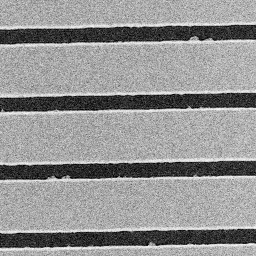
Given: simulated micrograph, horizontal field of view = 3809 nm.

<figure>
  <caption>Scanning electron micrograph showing lines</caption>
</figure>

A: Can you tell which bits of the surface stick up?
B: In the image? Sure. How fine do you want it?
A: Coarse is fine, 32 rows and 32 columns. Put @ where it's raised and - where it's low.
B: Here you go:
@@@@@@@@@@@@@@@@@@@@@@@@@@@@@@@@
@@@@@@@@@@@@@@@@@@@@@@@@@@@@@@@@
@@@@@@@@@@@@@@@@@@@@@@@@@@@@@@@@
@@------------------------------
--------------------------------
---------@@@@@@@@@@@@@@@@@@@@@@@
@@@@@@@@@@@@@@@@@@@@@@@@@@@@@@@@
@@@@@@@@@@@@@@@@@@@@@@@@@@@@@@@@
@@@@@@@@@@@@@@@@@@@@@@@@@@@@@@@@
@@@@@@@@@@@@@@@@@@@@@@@@@@@@@@@@
@@@@@@@@@@@@@@@@@@@@@@@@@@@@@@@@
@@@@@@@@@@@@@@@@@@@@@@@@@@@@@@@@
--------------------------------
--------------------------------
@@@@@@@@@@@@@@@@@@@@@@@@@@@@@@@@
@@@@@@@@@@@@@@@@@@@@@@@@@@@@@@@@
@@@@@@@@@@@@@@@@@@@@@@@@@@@@@@@@
@@@@@@@@@@@@@@@@@@@@@@@@@@@@@@@@
@@@@@@@@@@@@@@@@@@@@@@@@@@@@@@@@
@@@@@@@@@@@@@@@@@@@@@@@@@@@@@@@@
@@@@@@@@------------------------
--------------------------------
------@@@@@@@@@@@@@@@@@@@@@@@@@@
@@@@@@@@@@@@@@@@@@@@@@@@@@@@@@@@
@@@@@@@@@@@@@@@@@@@@@@@@@@@@@@@@
@@@@@@@@@@@@@@@@@@@@@@@@@@@@@@@@
@@@@@@@@@@@@@@@@@@@@@@@@@@@@@@@@
@@@@@@@@@@@@@@@@@@@@@@@@@@@@@@@@
@@@@@@@@@@@@@@@@@@@@@@@@@@@@@@@@
--------------------------------
-------------------------------@
@@@@@@@@@@@@@@@@@@@@@@@@@@@@@@@@